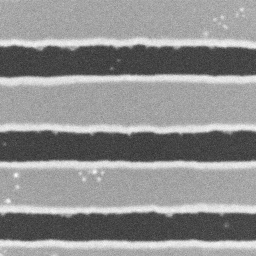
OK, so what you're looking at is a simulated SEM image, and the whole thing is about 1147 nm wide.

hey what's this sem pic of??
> lines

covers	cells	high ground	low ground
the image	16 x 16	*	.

****************
****************
****************
................
................
****************
****************
****************
................
................
****************
****************
****************
................
................
****************